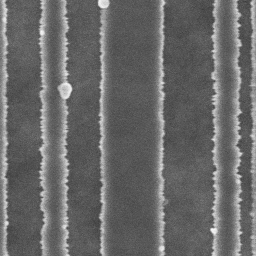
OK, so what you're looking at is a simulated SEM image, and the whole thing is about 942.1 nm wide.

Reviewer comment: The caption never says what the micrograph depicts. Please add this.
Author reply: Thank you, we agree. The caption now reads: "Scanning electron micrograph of lines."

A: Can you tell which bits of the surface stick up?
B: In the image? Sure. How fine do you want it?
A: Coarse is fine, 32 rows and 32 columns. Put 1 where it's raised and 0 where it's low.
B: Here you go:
10000111000011111111000000011101
10000111000001111111000000011101
10000111000001111111000000011101
10000111000001111111000000011100
10000111000001111111000000011100
10000111000001111111000000011100
10000111000001111111000000011100
10000111000001111111000000011100
10000111000001111111000000011100
10000111000001111111000000011100
10000111100001111111000000011100
10000111100001111111000000011100
10000111000001111111000000011100
10000111000001111111000000011100
10000111000001111111000000011100
10000111000001111111000000011100
10000111000001111111000000011100
10000111000001111111000000011100
10000111000001111111000000011100
10000111000001111111000000011100
10000111000001111111000000011100
10000111000001111111000000011100
10000111000001111111000000011100
10000111000001111111000000011100
10000111000001111111000000011100
10000111000001111111000000011100
10000111000001111111000000011100
10000011000001111111000000011100
10000111000001111111000000011100
10000111000001111111000000011100
10000111000001111111000000011100
10000111000001111111000000011100